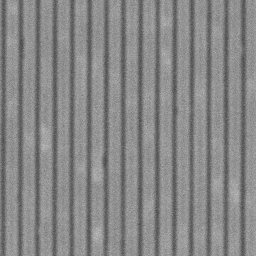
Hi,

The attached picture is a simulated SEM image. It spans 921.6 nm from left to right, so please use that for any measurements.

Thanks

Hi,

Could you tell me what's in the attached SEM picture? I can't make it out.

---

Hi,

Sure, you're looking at parallel lines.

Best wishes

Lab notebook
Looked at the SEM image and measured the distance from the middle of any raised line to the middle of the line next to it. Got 61.7 nm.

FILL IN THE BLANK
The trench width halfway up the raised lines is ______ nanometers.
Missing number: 20.7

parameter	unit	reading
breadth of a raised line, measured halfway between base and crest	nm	41